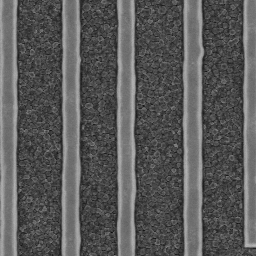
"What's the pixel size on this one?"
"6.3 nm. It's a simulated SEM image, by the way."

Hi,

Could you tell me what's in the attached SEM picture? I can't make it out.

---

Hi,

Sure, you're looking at parallel lines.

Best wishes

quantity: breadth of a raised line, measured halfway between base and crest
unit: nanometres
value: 97.7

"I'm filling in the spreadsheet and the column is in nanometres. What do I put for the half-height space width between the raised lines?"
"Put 292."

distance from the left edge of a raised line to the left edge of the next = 385 nm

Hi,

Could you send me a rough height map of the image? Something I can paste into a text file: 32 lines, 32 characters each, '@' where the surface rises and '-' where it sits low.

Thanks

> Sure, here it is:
@@------@@-----@@------@@------@
@@------@@-----@@------@@------@
@@------@@-----@@------@@------@
@@------@@-----@@------@@------@
@@------@@-----@@------@@------@
@@------@@-----@@------@@------@
@@------@@-----@@------@@------@
@@------@@-----@@------@@------@
@@------@@-----@@------@@------@
@@------@@-----@@------@@------@
@@------@@-----@@------@@------@
@@------@@-----@@------@@------@
@@------@@-----@@------@@------@
@@------@@-----@@------@@------@
@@------@@-----@@------@@------@
@@------@@-----@@------@@------@
@@------@@-----@@------@@------@
@@------@@-----@@------@@------@
@@------@@-----@@------@@------@
@@------@@-----@@------@@------@
@@------@@-----@@------@@------@
@@------@@-----@@------@@------@
@@------@@-----@@------@@------@
@@------@@-----@@------@@------@
@@------@@-----@@------@@------@
@@------@@-----@@------@@------@
@@------@@-----@@------@@------@
@@------@@-----@@------@@------@
@@------@@-----@@------@@------@
@@------@@-----@@------@@------@
@@------@@-----@@------@@------@
@@------@@-----@@------@@-------